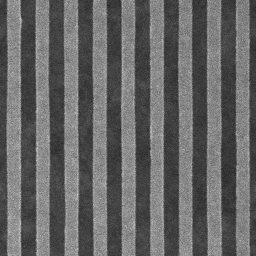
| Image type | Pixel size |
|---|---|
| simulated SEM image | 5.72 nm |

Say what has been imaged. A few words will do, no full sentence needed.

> parallel lines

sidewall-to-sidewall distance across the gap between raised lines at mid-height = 90.8 nm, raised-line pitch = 28.6 pixels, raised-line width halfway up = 0.0715 micrometres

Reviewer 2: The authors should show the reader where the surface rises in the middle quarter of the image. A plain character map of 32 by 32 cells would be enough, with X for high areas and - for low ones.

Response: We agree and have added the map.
XXX----XXX-----XXX----XXX----XXX
XXX----XXX-----XXX----XXX----XXX
XXX----XXX-----XXX----XXX----XXX
XXX----XXX-----XX-----XXX----XXX
XXX----XXX-----XX-----XXX----XXX
XXX----XXX-----XX-----XXX----XXX
XXX----XXX-----XX-----XXX----XXX
XXX----XXX-----XX-----XXX----XXX
XXX----XXX-----XX-----XXX----XXX
XXX-----XX-----XX-----XXX----XXX
XXX----XXX-----XX-----XXX----XXX
XXX----XXX-----XXX----XXX----XXX
XXX----XXX-----XXX----XXX----XXX
XXX----XXX-----XXX----XXX----XXX
XXX----XXX-----XXX----XXX----XXX
XXX----XXX-----XXX----XXX----XXX
XXX----XXX-----XXX----XXX----XXX
XXX----XXX-----XXX----XXX----XXX
XXX----XXX-----XXX----XXX----XXX
XXX----XXXX----XXX----XXX----XXX
XXX----XXXX----XXX----XXX----XXX
XXX----XXXX----XXX----XXX----XXX
XXX----XXXX----XXX----XXX----XXX
XXX----XXXX----XXX----XXX----XXX
XXX----XXXX----XXX----XXX----XXX
XXX----XXXX----XXX----XXX----XXX
XXX----XXXX----XXX----XXX----XXX
XXX----XXXX----XXX----XXX----XXX
XXX----XXXX----XXX----XXX----XXX
XXX----XXXX----XXX----XXX----XXX
XXX----XXXX----XXX----XXX----XXX
XXX----XXXX----XXX----XXX----XXX